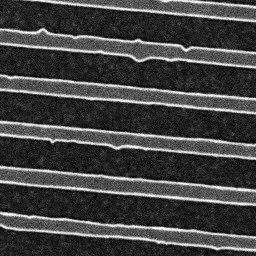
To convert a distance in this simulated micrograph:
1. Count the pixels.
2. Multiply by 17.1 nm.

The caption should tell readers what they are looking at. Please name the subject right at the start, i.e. parallel lines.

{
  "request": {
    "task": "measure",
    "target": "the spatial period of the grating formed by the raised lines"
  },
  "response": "782 nanometers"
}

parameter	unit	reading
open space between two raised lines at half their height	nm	536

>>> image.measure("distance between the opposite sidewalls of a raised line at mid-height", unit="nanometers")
240